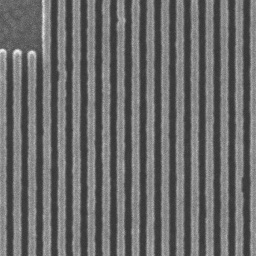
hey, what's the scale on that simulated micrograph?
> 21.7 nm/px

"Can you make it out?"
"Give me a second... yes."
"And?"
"parallel lines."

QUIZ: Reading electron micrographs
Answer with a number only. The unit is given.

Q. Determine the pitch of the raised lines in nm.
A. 321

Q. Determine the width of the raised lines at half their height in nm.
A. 149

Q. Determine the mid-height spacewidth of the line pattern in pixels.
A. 7.75